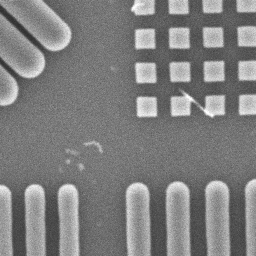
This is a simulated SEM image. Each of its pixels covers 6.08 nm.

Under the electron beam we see groups of lines, slits or small figures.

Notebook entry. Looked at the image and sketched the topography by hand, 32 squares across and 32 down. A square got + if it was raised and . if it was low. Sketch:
++++++...........++..++..+++..++
.++++++..........++..++...+.....
+.++++++........................
++.++++++.....................++
+++.+++++........++..+++.+++..++
++++.+++.........++..+++..++..++
+++++...........................
+++++...........................
..+++............++..+++..++..++
+..++............++..+++..++..++
++..............................
++..............................
++...............++..+++..++..++
.................+++.+++..++..++
.................+..............
................................
................................
................................
................................
................................
................................
................................
................................
+...+...+.......++...++...++...+
+..++..+++......+++..+++..+++..+
+..++..+++......+++..+++..+++..+
+..++..+++......+++..+++..++...+
+..++..+++......+++..+++..+++..+
+..+++.+++......+++..+++..+++..+
+..+++.+++......+++..+++..+++..+
++.+++.+++......+++..+++..+++..+
++.+++.+++......+++..+++..+++..+